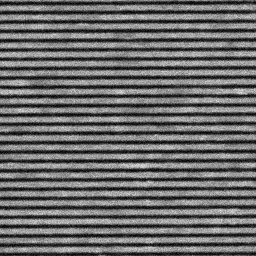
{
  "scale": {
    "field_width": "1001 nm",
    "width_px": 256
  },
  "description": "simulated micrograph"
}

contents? parallel lines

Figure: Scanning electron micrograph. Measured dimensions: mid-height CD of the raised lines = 0.0166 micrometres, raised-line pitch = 36.4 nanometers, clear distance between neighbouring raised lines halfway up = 0.0201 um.